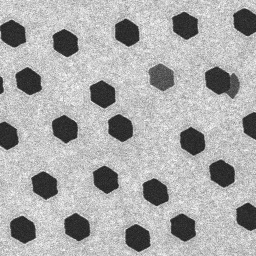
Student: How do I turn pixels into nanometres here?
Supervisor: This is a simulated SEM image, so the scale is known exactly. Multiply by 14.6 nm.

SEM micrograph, a regular array of holes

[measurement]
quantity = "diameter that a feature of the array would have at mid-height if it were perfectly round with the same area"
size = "383 nanometres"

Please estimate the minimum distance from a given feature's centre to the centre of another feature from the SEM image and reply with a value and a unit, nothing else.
732 nm